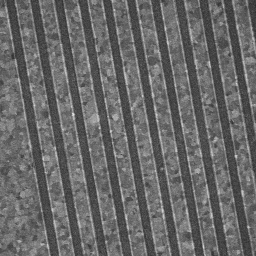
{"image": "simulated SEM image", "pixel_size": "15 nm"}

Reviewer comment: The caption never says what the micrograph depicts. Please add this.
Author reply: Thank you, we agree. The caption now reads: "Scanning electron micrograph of parallel lines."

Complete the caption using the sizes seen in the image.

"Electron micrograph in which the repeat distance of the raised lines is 0.356 µm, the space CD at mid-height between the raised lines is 0.155 micrometres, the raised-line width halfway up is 198 nanometres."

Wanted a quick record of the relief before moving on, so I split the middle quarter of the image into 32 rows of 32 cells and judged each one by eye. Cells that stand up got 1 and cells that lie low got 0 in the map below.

00011100011100011100011100011100
00011100011100011100011110011110
00011100011110011110011110011110
10011110011110001110001110001110
10001110001110001110001110001110
10001110001110001110001110001110
10001110001110001110001111001111
10001110001111001111001111001111
11001110001111001111001111001111
11001111001111000111000111000111
11000111000111000111000111000111
11000111000111000111000111000111
11000111000111000111000111100111
11000111000111100111100111100111
11100111100111100011100111100111
11100111100111100011100011100011
11100011100011100011100011100011
11100011100011100011100011100011
11100011100011100011100011110011
11100011100011110011110011110011
11110011110011110001110001110011
01110001110001110001110001110001
01110001110001110001110001110001
01110001110001110001110001110001
01110001110001111001110001110001
01111001110001111001111001111001
01111001111001111000111000111000
00111000111000111000111000111000
00111000111000111000111000111000
00111000111000111000111000111000
00111000111000111100111100111100
00111100111100011100111100111100